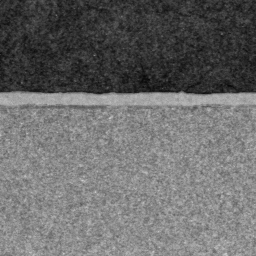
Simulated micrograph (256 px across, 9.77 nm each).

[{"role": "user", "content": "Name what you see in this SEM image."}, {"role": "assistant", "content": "one or a few lines or trenches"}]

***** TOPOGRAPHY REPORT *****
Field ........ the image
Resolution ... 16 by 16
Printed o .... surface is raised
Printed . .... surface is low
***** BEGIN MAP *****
................
................
................
................
................
................
oooooooooooooooo
oooooooooooooooo
oooooooooooooooo
oooooooooooooooo
oooooooooooooooo
oooooooooooooooo
oooooooooooooooo
oooooooooooooooo
oooooooooooooooo
oooooooooooooooo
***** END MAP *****